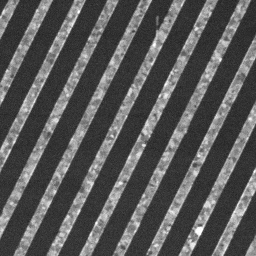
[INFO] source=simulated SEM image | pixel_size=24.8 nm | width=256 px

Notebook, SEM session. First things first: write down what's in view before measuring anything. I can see parallel lines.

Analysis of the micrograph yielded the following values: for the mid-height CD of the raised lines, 9.4 pixels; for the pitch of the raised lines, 0.733 µm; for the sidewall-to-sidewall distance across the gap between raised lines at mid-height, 499 nm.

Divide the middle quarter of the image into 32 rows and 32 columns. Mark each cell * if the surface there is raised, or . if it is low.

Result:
...**......***.....***......**..
..***......**......**......***..
..**......***.....***......**...
.***......**......**......***...
.**......**......***......**....
***......**......**......***....
**......**......***......**.....
**......**......**......***.....
*......***.....***......**......
*......**......**......***.....*
......***.....***......**......*
......**......**......***.....**
.....***.....***......**......**
.....**......**......***.....***
....***.....***......**......**.
....**......**......***.....***.
...***.....***......**......***.
...**......**......***.....***..
..***.....***......**......**...
..**......**......***.....***...
.***.....***......**......**....
.**......**......***.....***....
***.....***......**......**.....
**......**......***.....***.....
**.....***......**......**......
*......**......***.....***......
*.....***......**......**......*
......**......***.....***......*
.....***......**......**......**
.....**......***.....***......**
....***......**......**......***
....**......***.....***......**.